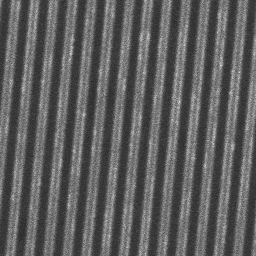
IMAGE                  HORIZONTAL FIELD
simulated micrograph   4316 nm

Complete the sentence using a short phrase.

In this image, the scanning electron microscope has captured parallel lines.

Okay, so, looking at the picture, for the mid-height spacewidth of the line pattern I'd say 0.157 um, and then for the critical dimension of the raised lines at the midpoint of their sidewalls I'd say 155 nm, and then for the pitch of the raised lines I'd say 0.318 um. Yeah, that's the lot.